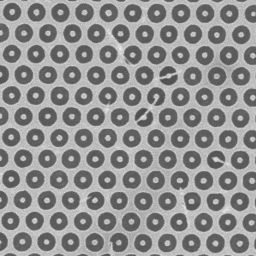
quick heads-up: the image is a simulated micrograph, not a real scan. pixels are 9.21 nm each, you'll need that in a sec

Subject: a regular array of ring-shaped grooves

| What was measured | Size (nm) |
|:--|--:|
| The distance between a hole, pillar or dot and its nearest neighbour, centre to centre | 219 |